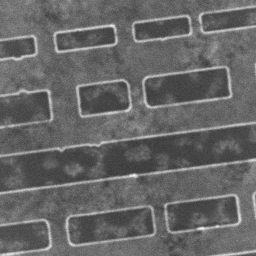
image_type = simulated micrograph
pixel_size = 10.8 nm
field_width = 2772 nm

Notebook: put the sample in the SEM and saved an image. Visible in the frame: one or a few lines or trenches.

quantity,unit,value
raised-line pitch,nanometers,708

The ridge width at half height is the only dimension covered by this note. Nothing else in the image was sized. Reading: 350 nanometres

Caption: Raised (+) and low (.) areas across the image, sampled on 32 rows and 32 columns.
++++++++++++++++++++++++++++++++
+++++++++++++++++++++++++++.....
+++++++++++++++++++.....+.......
++++++++++++..+++.......+.....++
+++++++........++.....++++++++++
....+++.......++++++++++++++++++
....++++++++++++++++++++++++++++
++++++++++++++++++++++++++++++++
+++++++++++++++++++++++++++.++++
++++++++++++++++++++.........+++
++++++++++++....++...........+++
++++..++++......++...........+++
......++++......++........++++++
......++++......++++++++++++++++
......++++++++++++++++++++++++++
...++++++++++++++++++++++++++++.
+++++++++++++++++++++++.........
+++++++++++++++.................
++++++++........................
................................
...........................+++++
....................++++++++++++
............++++++++++++++++++++
....++++++++++++++++++++++++++++
++++++++++++++++++++++++++++.+++
+++++++++++++++++++++.........++
+++++++++++++......++.........++
++++++++...........++.........++
......++...........++.....++++++
......+++.........++++++++++++++
......+++..+++++++++++++++++++++
...++++++++++++++++++++++++++++.